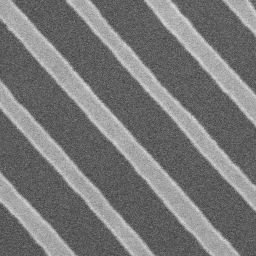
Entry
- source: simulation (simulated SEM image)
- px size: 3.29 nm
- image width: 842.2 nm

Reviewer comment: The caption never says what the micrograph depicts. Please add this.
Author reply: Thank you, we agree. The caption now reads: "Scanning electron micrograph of lines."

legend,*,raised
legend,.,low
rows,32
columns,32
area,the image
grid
**.......***.......***......***.
***.......**.......***.......***
****.......**.......***.......**
.***.......***.......***.......*
..***.......***.......***.......
...***.......***.......***......
....***.......***.......***.....
.....***.......**........***....
......***.......**........***...
.......***.......**.......****..
.......****.......**.......****.
*.......****.......**.......****
**.......***.......***.......***
***.......***.......***.......**
.***.......***.......***.......*
..***.......***.......***.......
...***.......***.......***......
....***.......***.......***.....
.....***.......***.......**.....
.....***........***.......**....
......***.......****.......**...
.......***.......****......***..
*.......***.......***.......***.
**.......***.......***.......***
***.......***.......***.......**
****.......***.......***.......*
.****.......**........***.......
..***........**.......****......
...***........**.......****.....
....***.......***.......****....
.....***.......***.......****...
......***.......***.......***...